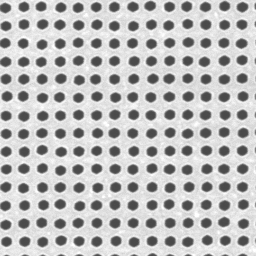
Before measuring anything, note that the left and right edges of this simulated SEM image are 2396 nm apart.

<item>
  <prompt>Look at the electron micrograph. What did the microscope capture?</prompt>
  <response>a regular array of holes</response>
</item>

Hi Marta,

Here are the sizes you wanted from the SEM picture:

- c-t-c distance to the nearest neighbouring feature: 163 nanometres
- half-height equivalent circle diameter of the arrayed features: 107 nanometres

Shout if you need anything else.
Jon